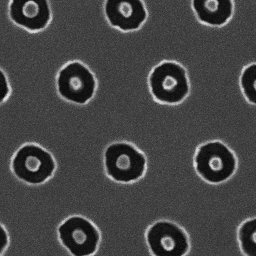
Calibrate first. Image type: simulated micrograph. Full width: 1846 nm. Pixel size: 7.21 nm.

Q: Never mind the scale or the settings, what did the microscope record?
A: ring-shaped grooves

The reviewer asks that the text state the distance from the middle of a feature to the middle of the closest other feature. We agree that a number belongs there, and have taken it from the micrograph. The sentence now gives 658 nm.